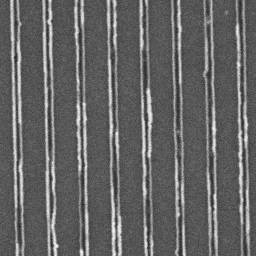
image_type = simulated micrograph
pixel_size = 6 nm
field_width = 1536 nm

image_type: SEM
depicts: parallel lines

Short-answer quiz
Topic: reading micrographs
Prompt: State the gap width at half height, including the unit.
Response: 146 nanometres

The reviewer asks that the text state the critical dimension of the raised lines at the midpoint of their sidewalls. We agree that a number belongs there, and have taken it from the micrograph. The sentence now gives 45.7 nanometres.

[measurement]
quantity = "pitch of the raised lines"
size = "193 nm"